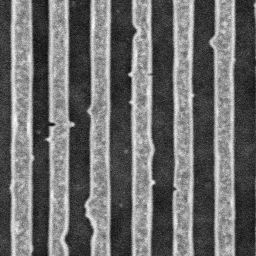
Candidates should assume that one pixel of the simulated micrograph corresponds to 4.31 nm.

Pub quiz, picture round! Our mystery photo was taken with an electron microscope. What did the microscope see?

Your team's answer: parallel lines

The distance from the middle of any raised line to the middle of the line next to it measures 40.5 pixels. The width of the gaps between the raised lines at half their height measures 23 px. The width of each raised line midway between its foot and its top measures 77 nm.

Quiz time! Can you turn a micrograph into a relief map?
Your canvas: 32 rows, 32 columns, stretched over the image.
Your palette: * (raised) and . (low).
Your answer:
..**..**....**...**...**...**...
..**..**...***...**...**...**...
..**..**...***...**...**...**...
..**..***..***...**...**...**...
..**..***..***...**...**...**...
..**..***..***...**...**..***...
..**..**...***...**...**...**...
..**..**...***...**...**...**...
..**..**...**....**...**...**...
..**..**...***..***...**...**...
..**..**...***...**...**...**...
..**..**...***...**...**...**...
..**..**...***..***...**...**...
..**..**...***...**...**...**...
..**..**...***...**...**...**...
..**..***..***...**...**...**...
..**..**...***...**...**...**...
..**..**...**....**...**...**...
..**..**...**....**...**...**...
..**..**...**....**...**...**...
..**..**...**....**...**...**...
..**..**...***...**...**...**...
..**..**...***...**...**...**...
.***..**...***...**...**...**...
..**..**...***...**...**...**...
..**..**...***...**...**...**...
..**..**...***...**...**...**...
..**..**...***...**...**...**...
..**..**....**...**...**...**...
..**..**....**...**...**...**...
..**..**...***...**...**...**...
..**..**...***...**...**...**...